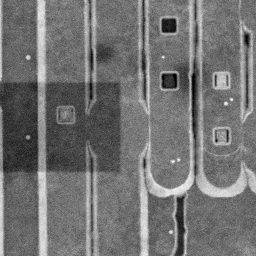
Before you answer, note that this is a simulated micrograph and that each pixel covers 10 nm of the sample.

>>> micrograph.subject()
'wiring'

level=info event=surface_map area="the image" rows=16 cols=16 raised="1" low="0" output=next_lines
0001111111111111
0001111111011111
0001111111111111
0001111111111111
0001111111111111
0001111111011111
0001111111111111
0001111111111111
0001111111111111
0001111111111111
0001111111111111
0001111111110110
0001111110000000
0001111110000000
0001111110000000
0001111110000000